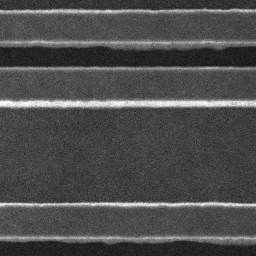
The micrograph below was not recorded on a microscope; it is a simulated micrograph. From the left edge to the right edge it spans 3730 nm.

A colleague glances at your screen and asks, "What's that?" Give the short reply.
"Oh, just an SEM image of lines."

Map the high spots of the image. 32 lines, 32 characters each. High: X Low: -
--------------------------------
---X-XXXX-XXXXXXXXXXXXXXXXXXXXXX
XXXXXXXXXXXXXXXXXXXXXXXXXXXXXXXX
XXXXXXXXXXXXXXXXXXXXXXXXXXXXXXXX
XXXXXXXXXXXXXXXXXXXXXXXXXXXXXXXX
--------------------------------
--------------------------------
--------------------------------
-----------XX-XX---XXXX--XXXX--X
XXXXXXXXXXXXXXXXXXXXXXXXXXXXXXXX
XXXXXXXXXXXXXXXXXXXXXXXXXXXXXXXX
XXXXXXXXXXXXXXXXXXXXXXXXXXXXXXXX
XXXXXXXXXXXXXXXXXXXXXXXXXXXXXXXX
--------------------------------
--------------------------------
--------------------------------
--------------------------------
--------------------------------
--------------------------------
--------------------------------
--------------------------------
--------------------------------
--------------------------------
--------------------------------
--------------------------------
--------------------------------
XXXXXXXXXXXXXXXXXXXXXXXXXXXXXXXX
XXXXXXXXXXXXXXXXXXXXXXXXXXXXXXXX
XXXXXXXXXXXXXXXXXXXXXXXXXXXXXXXX
XXXXXXXXXXXXXXXXXXXXXXXXXXXXXXXX
--------------------------------
--------------------------------